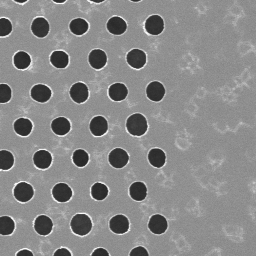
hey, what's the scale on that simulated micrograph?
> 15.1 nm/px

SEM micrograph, a regular array of holes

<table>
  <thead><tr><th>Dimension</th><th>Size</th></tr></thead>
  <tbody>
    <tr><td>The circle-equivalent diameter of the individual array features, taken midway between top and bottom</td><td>296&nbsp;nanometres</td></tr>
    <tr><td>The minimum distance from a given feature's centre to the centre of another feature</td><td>572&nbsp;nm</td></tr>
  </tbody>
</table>